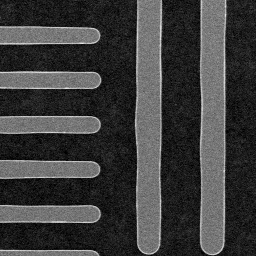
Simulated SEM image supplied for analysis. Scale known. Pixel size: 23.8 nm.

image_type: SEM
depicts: groups of lines, slits or small figures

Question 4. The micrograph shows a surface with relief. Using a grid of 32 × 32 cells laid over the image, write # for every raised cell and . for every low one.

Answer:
.................###.....###....
.................###.....###....
.................###.....###....
##########.......###.....###....
############.....###.....###....
.................###.....###....
.................###.....###....
.................###.....###....
.................###.....###....
############.....###.....###....
############.....###.....###....
.................###.....###....
.................###.....###....
.................###.....###....
.................###.....###....
############.....###.....###....
############.....###.....###....
.................###.....###....
.................###.....###....
.................###.....###....
############.....###.....###....
############.....###.....###....
.................###.....###....
.................###.....###....
.................###.....###....
.................###.....###....
############.....###.....###....
############.....###.....###....
.................###.....###....
.................###.....###....
.................###.....###....
############......#.......#.....